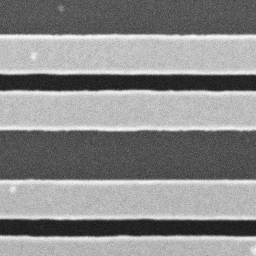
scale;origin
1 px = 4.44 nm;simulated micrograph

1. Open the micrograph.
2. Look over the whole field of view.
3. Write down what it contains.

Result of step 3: lines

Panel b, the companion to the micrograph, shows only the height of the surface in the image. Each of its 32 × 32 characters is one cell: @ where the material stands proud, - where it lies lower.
--------------------------------
--------------------------------
--------------------------------
--------------------------------
@@@@@@@@@@@@@@@@@@@@@-@@@@@@@@@@
@@@@@@@@@@@@@@@@@@@@@@@@@@@@@@@@
@@@@@@@@@@@@@@@@@@@@@@@@@@@@@@@@
@@@@@@@@@@@@@@@@@@@@@@@@@@@@@@@@
@@@@@@@@@@@@@@@@@@@@@@@@@@@@@@@@
--------------------------------
--------------------------------
@@@@@@@@@@@@@@@@@@@@@@@@@@@@@@@@
@@@@@@@@@@@@@@@@@@@@@@@@@@@@@@@@
@@@@@@@@@@@@@@@@@@@@@@@@@@@@@@@@
@@@@@@@@@@@@@@@@@@@@@@@@@@@@@@@@
@@@@@@@@@@@@@@@@@@@@@@@@@@@@@@@@
--------------------------------
--------------------------------
--------------------------------
--------------------------------
--------------------------------
--------------------------------
----@---------------------------
@@@@@@@@@@@@@@@@@@@@@@@@@@@@@@@@
@@@@@@@@@@@@@@@@@@@@@@@@@@@@@@@@
@@@@@@@@@@@@@@@@@@@@@@@@@@@@@@@@
@@@@@@@@@@@@@@@@@@@@@@@@@@@@@@@@
--------------------------------
--------------------------------
--------------------------------
@@@@@@@@@@@@@@@@@@@@@@@@@@@@@@@@
@@@@@@@@@@@@@@@@@@@@@@@@@@@@@@@@